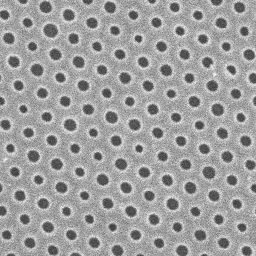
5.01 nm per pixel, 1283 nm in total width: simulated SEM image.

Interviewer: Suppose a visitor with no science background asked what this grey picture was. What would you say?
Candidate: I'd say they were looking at a regular array of holes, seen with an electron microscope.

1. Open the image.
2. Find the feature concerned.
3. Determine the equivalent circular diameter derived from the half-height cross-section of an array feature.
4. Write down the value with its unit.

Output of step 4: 56.5 nanometers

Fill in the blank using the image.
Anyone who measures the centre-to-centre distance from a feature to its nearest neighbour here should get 23.9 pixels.